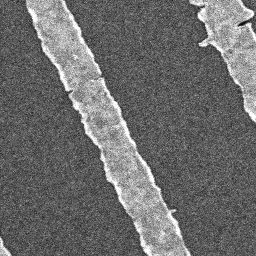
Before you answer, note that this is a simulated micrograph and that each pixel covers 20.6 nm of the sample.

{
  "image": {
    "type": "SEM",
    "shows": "one or a few lines or trenches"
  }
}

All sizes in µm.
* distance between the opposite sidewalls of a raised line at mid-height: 0.74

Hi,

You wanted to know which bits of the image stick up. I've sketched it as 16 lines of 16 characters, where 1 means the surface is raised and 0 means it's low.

0011000000001110
0011100000000110
0001100000000111
0001110000000011
0000110000000011
0000111000000001
0000011000000001
0000011100000000
0000001100000000
0000001110000000
0000000110000000
0000000111000000
0000000011000000
0000000011100000
0000000001100000
0000000001110000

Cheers